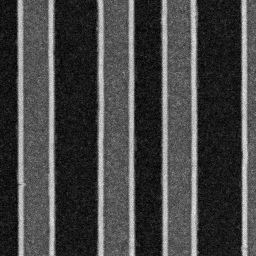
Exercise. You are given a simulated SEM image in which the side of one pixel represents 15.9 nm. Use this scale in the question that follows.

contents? one or a few lines or trenches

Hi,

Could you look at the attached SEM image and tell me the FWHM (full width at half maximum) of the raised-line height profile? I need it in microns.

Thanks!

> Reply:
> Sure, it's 0.484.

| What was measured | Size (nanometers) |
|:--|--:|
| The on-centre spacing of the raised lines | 1140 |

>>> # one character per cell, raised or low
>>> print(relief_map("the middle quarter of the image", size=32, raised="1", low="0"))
00000000011111111000000001111111
00000000011111111000000001111111
00000000011111111000000001111111
00000000011111111000000001111111
00000000011111111000000001111111
00000000011111111000000001111111
00000000011111111000000001111111
00000000011111111000000001111111
00000000011111111000000001111111
00000000001111111000000001111111
00000000001111111000000001111111
00000000001111111000000001111111
00000000001111111000000001111111
00000000011111111000000001111111
00000000011111111000000001111111
00000000011111111000000001111111
00000000011111111000000001111111
00000000011111111000000001111111
00000000011111111000000001111111
00000000011111111000000001111111
00000000011111111000000001111111
00000000011111111000000001111111
00000000011111111000000001111111
00000000011111111000000001111111
00000000011111111000000001111111
00000000011111111000000001111111
00000000011111111000000001111111
00000000011111111000000001111111
00000000011111111000000001111111
00000000011111111000000001111111
00000000011111111000000001111111
00000000011111111000000001111111